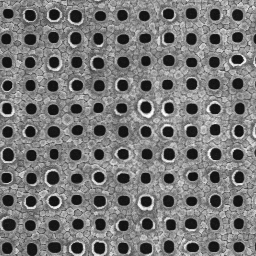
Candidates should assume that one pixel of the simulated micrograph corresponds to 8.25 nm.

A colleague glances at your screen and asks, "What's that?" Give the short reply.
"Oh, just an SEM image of a regular array of holes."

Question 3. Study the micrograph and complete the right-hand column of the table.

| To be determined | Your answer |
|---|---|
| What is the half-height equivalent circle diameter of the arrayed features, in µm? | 0.0903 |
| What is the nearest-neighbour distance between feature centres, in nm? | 183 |